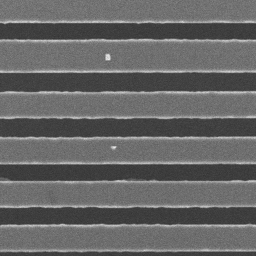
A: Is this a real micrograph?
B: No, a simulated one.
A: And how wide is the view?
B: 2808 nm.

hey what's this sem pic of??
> lines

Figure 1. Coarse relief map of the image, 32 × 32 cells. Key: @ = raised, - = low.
@@@@@@@@@@@@@@@@@@@@@@@@@@@@@@@@
@@@@@@@@@@@@@@@@@@@@@@@@@@@@@@@@
@@@@@@@@@@@@@@@@@@@@@@@@@@@@@@@@
--------------------------------
--------------------------------
@@@@@@@@@@@@@@@@@@@@@@@@@@@@@@@@
@@@@@@@@@@@@@@@@@@@@@@@@@@@@@@@@
@@@@@@@@@@@@@@@@@@@@@@@@@@@@@@@@
@@@@@@@@@@@@@@@@@@@@@@@@@@@@@@@@
--------------------------------
--------------------------------
@@@-@@@@@@@-@@@@@@@@@@@@@@@@@@@@
@@@@@@@@@@@@@@@@@@@@@@@@@@@@@@@@
@@@@@@@@@@@@@@@@@@@@@@@@@@@@@@@@
@@@@@@@@@@@@@@@@@@@@@@@@@@@@@@@@
--------------------------------
--------------------------------
@@@@@@@@@@@@@@@@@@@@@@@@@@@@@@@@
@@@@@@@@@@@@@@@@@@@@@@@@@@@@@@@@
@@@@@@@@@@@@@@@@@@@@@@@@@@@@@@@@
--------------------------------
--------------------------------
--------------------------------
@@@@@@@@@@@@@@@@@@@@@@@@@@@@@@@@
@@@@@@@@@@@@@@@@@@@@@@@@@@@@@@@@
@@@@@@@@@@@@@@@@@@@@@@@@@@@@@@@@
--------------------------------
--------------------------------
@@@@@@@@@@@@@@@@@@@@@@@@@@@@@@@@
@@@@@@@@@@@@@@@@@@@@@@@@@@@@@@@@
@@@@@@@@@@@@@@@@@@@@@@@@@@@@@@@@
--------------------------------